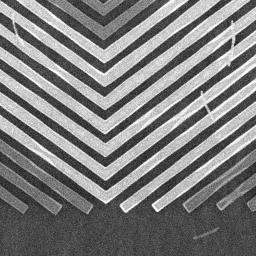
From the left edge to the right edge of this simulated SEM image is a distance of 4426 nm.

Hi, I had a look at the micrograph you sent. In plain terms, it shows groups of lines, slits or small figures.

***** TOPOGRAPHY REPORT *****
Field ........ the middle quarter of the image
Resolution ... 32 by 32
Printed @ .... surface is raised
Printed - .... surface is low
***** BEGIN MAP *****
---@@@@------@@@@----@@@@----@@@
-----@@@---@@@@@---@@@@@---@@@@-
@-----@@@@@@@@@---@@@@----@@@@--
@@@----@@@@@@---@@@@@---@@@@@---
-@@@-----@@@---@@@@@---@@@@----@
--@@@@----@---@@@@----@@@@----@@
----@@@-----@@@@@----@@@@---@@@@
-----@@@@--@@@@@---@@@@----@@@@-
@@----@@@@@@@@----@@@@----@@@@--
@@@-----@@@@@---@@@@@---@@@@----
-@@@@----@@@---@@@@----@@@@----@
--@@@@--------@@@@----@@@-----@@
----@@@@-----@@@@----@@@-----@@@
@----@@@@--@@@@@----@@@-----@@--
@@----@@@@@@@@----@@@-----@@@---
@@@@---@@@@@@----@@@-----@@@----
-@@@@----@@----@@@@----@@@@----@
--@@@@@-------@@@@----@@@@----@@
----@@@@-----@@@@---@@@@@---@@@@
@----@@@@@-@@@@----@@@@----@@@@-
@@@---@@@@@@@@----@@@@----@@@@--
@@@@----@@@@@----@@@----@@@@----
-@@@@@---@@----@@@@----@@@@----@
---@@@@-------@@@@----@@@-----@@
----@@@@----@@@@-----@@@----@@@@
@-----@@@@-@@@@----@@@-----@@@@-
@@@----@@@@@@@----@@@-----@@@---
@@@@----@@@@-----@@@----@@@@----
--@@@@---@@----@@@@----@@@@----@
---@@@@-------@@@-----@@@----@@@
----@@@@@---@@@@----@@@@----@@@@
@@----@@@@-@@@@----@@@@----@@@@-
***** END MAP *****